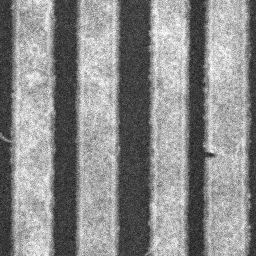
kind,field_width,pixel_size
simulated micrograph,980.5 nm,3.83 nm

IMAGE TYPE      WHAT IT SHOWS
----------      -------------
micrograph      one or a few lines or trenches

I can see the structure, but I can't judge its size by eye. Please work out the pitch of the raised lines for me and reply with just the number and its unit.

64.6 px